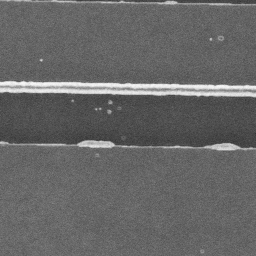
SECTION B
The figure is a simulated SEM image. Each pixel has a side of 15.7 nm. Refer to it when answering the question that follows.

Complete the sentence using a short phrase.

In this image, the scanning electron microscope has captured lines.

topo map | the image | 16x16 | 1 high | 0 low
1111111111111111
1111111111111111
1111111111111111
1111111111111111
1111111111111111
1111111111111111
0000000000000000
0000000000000000
0000000000000000
1111111111111111
1111111111111111
1111111111111111
1111111111111111
1111111111111111
1111111111111111
1111111111111111